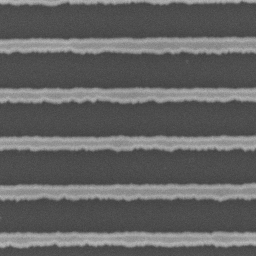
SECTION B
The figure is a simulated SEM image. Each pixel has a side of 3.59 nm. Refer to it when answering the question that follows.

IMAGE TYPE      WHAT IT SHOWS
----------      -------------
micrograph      lines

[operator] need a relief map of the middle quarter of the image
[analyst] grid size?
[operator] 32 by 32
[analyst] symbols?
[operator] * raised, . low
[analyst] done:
................................
................................
................................
................................
................................
................................
..***..**........****...........
********************************
********************************
................................
................................
................................
................................
................................
................................
................................
................................
................................
.............**.........*.......
********************************
********************************
................................
................................
................................
................................
................................
................................
................................
................................
................................
.............*..**..*.....***..*
********************************